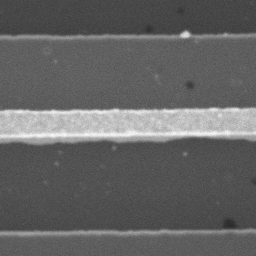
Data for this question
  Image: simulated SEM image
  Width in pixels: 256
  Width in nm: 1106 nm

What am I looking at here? lines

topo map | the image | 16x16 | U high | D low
DDDDDDDDDDDDDDDD
DDDDDDDDDDDDDDDD
UUUUUUUUUUUUUUUU
UUUUUUUUUUUUUUUU
UUUUUUUUUUUUUUUU
UUUUUUUUUUUUUUUU
UUUUUUUUUUUUUUUU
UUUUUUUUUUUUUUUU
UUUUUUUUUUUDDDDD
DDDDDDDDDDDDDDDD
DDDDDDDDDDDDDDDD
DDDDDDDDDDDDDDDD
DDDDDDDDDDDDDDDD
DDDDDDDDDDDDDDDD
DDDDUUUUUUUUUUUU
UUUUUUUUUUUUUUUU